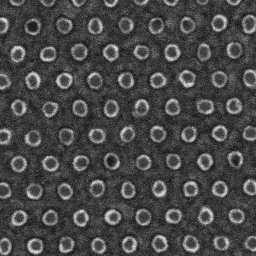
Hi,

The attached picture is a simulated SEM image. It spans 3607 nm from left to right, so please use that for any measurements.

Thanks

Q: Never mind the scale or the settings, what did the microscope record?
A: a regular array of raised bodies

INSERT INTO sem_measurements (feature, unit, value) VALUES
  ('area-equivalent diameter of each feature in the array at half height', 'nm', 206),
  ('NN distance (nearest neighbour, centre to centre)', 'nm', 427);